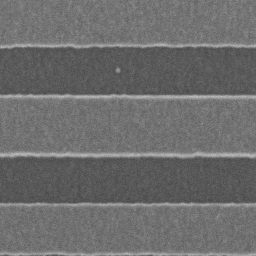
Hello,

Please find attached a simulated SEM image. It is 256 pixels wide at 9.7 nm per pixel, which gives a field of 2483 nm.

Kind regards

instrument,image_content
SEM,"lines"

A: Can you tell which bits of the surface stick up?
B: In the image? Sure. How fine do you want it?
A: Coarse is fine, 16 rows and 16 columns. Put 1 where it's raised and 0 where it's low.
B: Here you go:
1111111111111111
1111111111111111
1111111111111111
0000000000000000
0000000000000000
0000000000000000
1111111111111111
1111111111111111
1111111111111111
1111111111111111
0000000000000000
0000000000000000
0000000000000000
1111111111111111
1111111111111111
1111111111111111